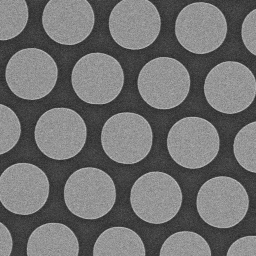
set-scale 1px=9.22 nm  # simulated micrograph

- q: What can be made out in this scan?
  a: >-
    an array of small figures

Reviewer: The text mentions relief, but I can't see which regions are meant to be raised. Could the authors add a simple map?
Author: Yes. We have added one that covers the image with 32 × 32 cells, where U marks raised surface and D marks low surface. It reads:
UUUDDDUUUUUDDDDUUUUDDDDDUUDDDDDD
UUUDDUUUUUUUDDUUUUUUDDDUUUUUDDDU
UUUDDUUUUUUUDDUUUUUUDDUUUUUUDDDU
UUUDDDUUUUUUDDUUUUUUDDUUUUUUDDUU
UUDDDDUUUUUDDDUUUUUUDDUUUUUUDDUU
DDDDDDDDUDDDDDDUUUUDDDDUUUUUDDDU
DDUUUUDDDDDDDDDDDDDDDDDDUUDDDDDU
DUUUUUUDDDUUUUDDDDDUUUDDDDDDDDDD
DUUUUUUDDUUUUUUDDDUUUUUDDDDUUUUD
DUUUUUUDDUUUUUUDDUUUUUUUDDUUUUUU
DUUUUUUDDUUUUUUDDUUUUUUUDDUUUUUU
DDUUUUDDDUUUUUUDDUUUUUUUDDUUUUUU
DDDDDDDDDDUUUUDDDDUUUUUDDDUUUUUU
UDDDDDDUDDDDDDDDDDDDUDDDDDDUUUUD
UUDDDUUUUUDDDDUUUUDDDDDDDDDDDDDD
UUDDDUUUUUUDDUUUUUUDDDUUUUDDDDDU
UUUDUUUUUUUDDUUUUUUDDUUUUUUDDDUU
UUDDUUUUUUUDDUUUUUUDDUUUUUUDDUUU
UDDDDUUUUUDDDUUUUUUDDUUUUUUDDUUU
DDDDDDUUUDDDDDUUUUDDDUUUUUUDDUUU
DDUUDDDDDDDDDDDDDDDDDDUUUUDDDDUU
UUUUUDDDDUUUUDDDDDDUDDDDDDDDDDDD
UUUUUUDDUUUUUUDDDUUUUUDDDDUUUDDD
UUUUUUDDUUUUUUDDDUUUUUDDDUUUUUDD
UUUUUUDDUUUUUUDDUUUUUUUDDUUUUUUD
UUUUUUDDUUUUUUDDUUUUUUUDDUUUUUUD
DDUUDDDDDUUUUDDDDUUUUUDDDUUUUUUD
DDDDDDDDDDDDDDDDDDUUUDDDDUUUUUDD
UDDDDUUUUDDDDDUUDDDDDDDDDDDDDDDD
UDDDUUUUUDDDUUUUUDDDDUUUUDDDDDDD
UUDUUUUUUUDDUUUUUUDDUUUUUUDDDUUU
UDDUUUUUUUDDUUUUUUDDUUUUUUDDUUUU